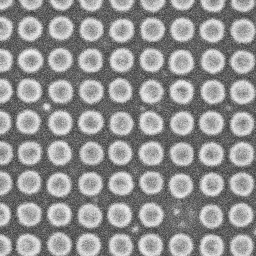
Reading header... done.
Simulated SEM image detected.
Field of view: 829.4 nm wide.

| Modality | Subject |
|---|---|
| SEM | a regular array of raised bodies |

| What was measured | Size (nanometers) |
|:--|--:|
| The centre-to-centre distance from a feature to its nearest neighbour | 96.2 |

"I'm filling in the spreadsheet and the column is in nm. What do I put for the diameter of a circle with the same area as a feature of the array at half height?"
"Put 69.6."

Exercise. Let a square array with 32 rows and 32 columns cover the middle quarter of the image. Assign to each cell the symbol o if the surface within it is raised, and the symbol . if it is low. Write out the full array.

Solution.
o...ooooo...oooo....oooo...ooooo
......oo......o......oo....oooo.
................................
................................
......oo.....ooo.....oo.........
o...ooooo...oooo....oooo...ooooo
oo..ooooo...oooo...ooooo...ooooo
oo..ooooo...oooo...oooooo..ooooo
o....oooo...oooo....oooo...ooooo
.............................oo.
................................
................................
.....ooo.....oo.....ooo......oo.
o...ooooo...ooooo..ooooo....oooo
oo..ooooo...ooooo..ooooo...ooooo
oo..ooooo...ooooo..ooooo...ooooo
o....oooo...oooo....oooo....oooo
................................
................................
................................
o....oooo...oooo....oooo....ooo.
o....oooo...oooo...ooooo...ooooo
oo..oooooo..ooooo..oooooo..ooooo
o...ooooo...ooooo...oooo...ooooo
.....oooo....ooo....oooo....ooo.
................................
................................
..............oo....ooo.........
o....oooo...ooooo..ooooo...oooo.
o...ooooo...ooooo..ooooo...ooooo
o...ooooo...ooooo..ooooo...ooooo
o....oooo...oooo....oooo...oooo.